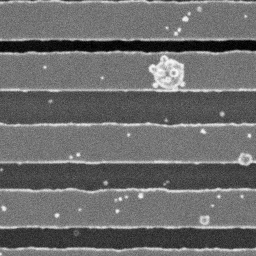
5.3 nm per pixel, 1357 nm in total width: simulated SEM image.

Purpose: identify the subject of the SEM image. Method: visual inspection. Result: lines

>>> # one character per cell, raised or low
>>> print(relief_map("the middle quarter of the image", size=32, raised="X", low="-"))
XXXXXXXXXXXXXXXXXXXXXXXXXXXXXXXX
XXXXXXXXXXXXXXXXXXXXXXXXXXXXXXXX
XXXXXXXXXXXXXXXXXXXXXXXXXXXXXXXX
XXXXXXXXXXXXXXXXXXXXXXXXXXXXXXXX
XXXXXXXXXXXXXXXXXXXXXXXXXXXXXXXX
XXXXXXXXXXXXXXXXXXXXXXXXXXXXXXXX
XXXXXXXXXXXXXXXXXXXXXXXXXXXXXXXX
--------------------------------
--------------------------------
--------------------------------
--------------------------------
--------------------------------
--------------------------------
--------------------------------
--------------------------------
XXXXXXXXXXXXXXXXXXXXXXXXXX-XXXXX
XXXXXXXXXXXXXXXXXXXXXXXXXXXXXXXX
XXXXXXXXXXXXXXXXXXXXXXXXXXXXXXXX
XXXXXXXXXXXXXXXXXXXXXXXXXXXXXXXX
XXXXXXXXXXXXXXXXXXXXXXXXXXXXXXXX
XXXXXXXXXXXXXXXXXXXXXXXXXXXXXXXX
XXXXXXXXXXXXXXXXXXXXXXXXXXXXXXXX
XXXXXXXXXXXXXXXXXXXXXXXXXXXXXXXX
XXXXXXXXXXXXXXXXXXXXXXXXXXXXXXXX
XXXXXXXXXXXXXXXXXXXXXXXXXXXXXXXX
--------------------------------
--------------------------------
--------------------------------
--------------------------------
--------------------------------
--------------------------------
XXXX-----XXXXXXXXXXXXXXXXX------